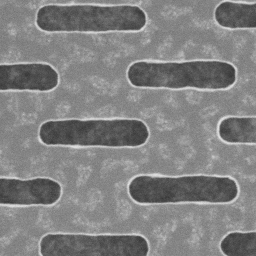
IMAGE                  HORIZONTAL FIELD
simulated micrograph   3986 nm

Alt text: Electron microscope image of holes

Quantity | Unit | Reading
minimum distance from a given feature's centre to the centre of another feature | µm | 1.63